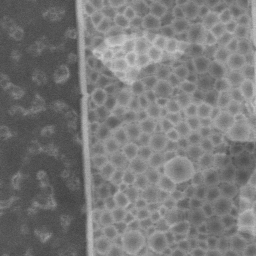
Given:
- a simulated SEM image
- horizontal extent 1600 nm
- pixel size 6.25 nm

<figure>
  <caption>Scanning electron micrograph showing one or a few lines or trenches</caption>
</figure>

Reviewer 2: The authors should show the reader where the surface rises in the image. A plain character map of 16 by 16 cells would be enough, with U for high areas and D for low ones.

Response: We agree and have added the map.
DDDDDUUUUUUUUUUU
DDDDDUUUUUUUUUUU
DDDDDUUUUUUUUUUU
DDDDDUUUUUUUUUUU
DDDDDUUUUUUUUUUU
DDDDDUUUUUUUUUUU
DDDDDUUUUUUUUUUU
DDDDDUUUUUUUUUUU
DDDDDUUUUUUUUUUU
DDDDDUUUUUUUUUUU
DDDDDUUUUUUUUUUU
DDDDDDUUUUUUUUUU
DDDDDDUUUUUUUUUU
DDDDDDUUUUUUUUUU
DDDDDDUUUUUUUUUU
DDDDDDUUUUUUUUUU